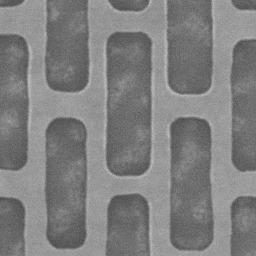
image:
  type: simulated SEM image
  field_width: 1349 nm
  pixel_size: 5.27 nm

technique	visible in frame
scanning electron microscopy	holes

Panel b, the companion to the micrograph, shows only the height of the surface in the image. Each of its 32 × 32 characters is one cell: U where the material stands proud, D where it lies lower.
DDDUUUDDDDDUUUDDDDDUUDDDDDDUUDDD
UUUUUUDDDDDUUUUUUUUUUDDDDDDUUUUU
UUUUUUDDDDDUUUUUUUUUUDDDDDDUUUUU
UUUUUUDDDDDUUUUUUUUUUDDDDDDUUUUU
DDDUUUDDDDDUUUDDDDDUUDDDDDDUUUUU
DDDUUUDDDDDUUDDDDDDUUDDDDDDUUUDD
DDDDUUDDDDDUUDDDDDDUUDDDDDDUUDDD
DDDDUUDDDDDUUDDDDDDUUDDDDDDUUDDD
DDDDUUDDDDDUUDDDDDDUUDDDDDDUUDDD
DDDDUUDDDDDUUDDDDDDUUDDDDDDUUDDD
DDDDUUDDDDDUUDDDDDDUUDDDDDUUUDDD
DDDDUUUDDDUUUDDDDDDUUUDDDDUUUDDD
DDDDUUUUUUUUUDDDDDDUUUUUUUUUUDDD
DDDDUUUUUUUUUDDDDDDUUUUUUUUUUDDD
DDDDUUUUUUUUUDDDDDDUUUUUUUUUUDDD
DDDDUUDDDDUUUDDDDDDUUDDDDDUUUDDD
DDDDUUDDDDDUUDDDDDDUUDDDDDUUUDDD
DDDDUUDDDDDUUDDDDDDUUDDDDDDUUDDD
DDDDUUDDDDDUUDDDDDDUUDDDDDDUUDDD
DDDUUUDDDDDUUDDDDDDUUDDDDDDUUDDD
DDDUUUDDDDDUUDDDDDDUUDDDDDDUUDDD
UUUUUUDDDDDUUUDDDDUUUDDDDDUUUUDU
UUUUUUDDDDDUUUUUUUUUUDDDDDUUUUUU
UUUUUUDDDDDUUUUUUUUUUDDDDDDUUUUU
UUUUUUDDDDDUUUDDDDUUUDDDDDDUUUDD
DDDUUUDDDDDUUUDDDDDUUDDDDDDUUDDD
DDDUUUDDDDDUUDDDDDDUUDDDDDDUUDDD
DDDUUUDDDDDUUDDDDDDUUDDDDDDUUDDD
DDDUUUDDDDDUUDDDDDDUUDDDDDDUUDDD
DDDUUUDDDDDUUDDDDDDUUDDDDDDUUDDD
DDDUUUDDDDUUUDDDDDDUUDDDDDUUUDDD
DDDUUUUUUUUUUDDDDDDUUUUUUUUUUDDD